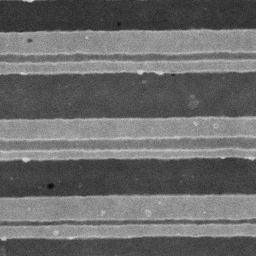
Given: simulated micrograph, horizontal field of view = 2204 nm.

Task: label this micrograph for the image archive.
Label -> lines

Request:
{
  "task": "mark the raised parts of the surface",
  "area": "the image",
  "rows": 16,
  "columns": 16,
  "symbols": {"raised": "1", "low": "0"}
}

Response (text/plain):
0000000000000000
0000000000000000
1111111111111111
1111111111111111
1111111111110000
0000000000000000
0000000000000000
0111111111111111
1111111111111111
1111111111111111
0000000000000000
0000000000000000
1111111111111111
1111111111111111
1111111111111111
0000000000000000